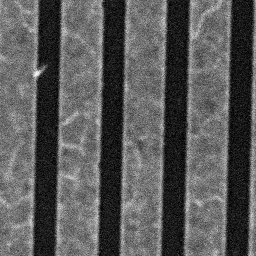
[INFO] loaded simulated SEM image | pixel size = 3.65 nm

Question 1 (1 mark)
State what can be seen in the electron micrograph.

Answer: one or a few lines or trenches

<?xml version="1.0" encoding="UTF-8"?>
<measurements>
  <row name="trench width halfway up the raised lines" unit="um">0.0899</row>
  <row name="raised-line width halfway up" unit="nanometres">143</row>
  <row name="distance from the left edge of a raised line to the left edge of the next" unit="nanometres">233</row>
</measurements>